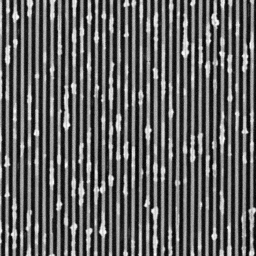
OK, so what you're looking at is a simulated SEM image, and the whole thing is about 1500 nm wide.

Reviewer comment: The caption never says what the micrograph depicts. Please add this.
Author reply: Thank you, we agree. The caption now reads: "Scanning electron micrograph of parallel lines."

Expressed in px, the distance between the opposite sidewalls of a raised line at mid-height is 2.63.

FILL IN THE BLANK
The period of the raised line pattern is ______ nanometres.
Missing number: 43.4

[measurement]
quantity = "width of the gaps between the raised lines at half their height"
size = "24.9 nanometers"